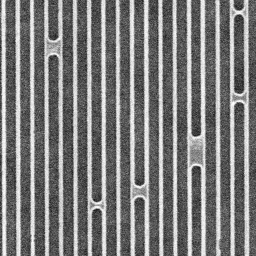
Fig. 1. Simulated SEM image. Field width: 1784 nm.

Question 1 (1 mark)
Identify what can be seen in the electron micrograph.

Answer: parallel lines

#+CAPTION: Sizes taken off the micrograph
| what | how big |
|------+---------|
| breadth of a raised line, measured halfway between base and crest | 0.0209 µm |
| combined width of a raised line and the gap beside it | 99.5 nanometres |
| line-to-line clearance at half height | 76.7 nanometers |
